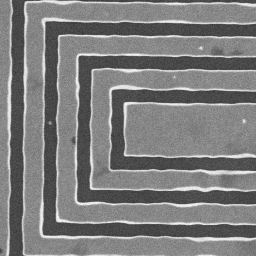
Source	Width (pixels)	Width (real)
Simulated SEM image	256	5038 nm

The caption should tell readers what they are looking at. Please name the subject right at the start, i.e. groups of lines, slits or small figures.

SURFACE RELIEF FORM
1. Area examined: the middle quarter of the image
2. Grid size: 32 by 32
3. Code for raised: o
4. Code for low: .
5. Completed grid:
ooo.............................
ooo....oooooooo....oooooo.....oo
ooo....ooooooooooooooooooooooooo
ooo....ooooooooooooooooooooooooo
ooo....ooooooooooooooooooooooooo
oooo...ooooooooooooooooooooooooo
ooo....ooooo....................
ooo....ooooo....................
oooo...ooooo....................
oooo...ooooo....................
oooo...ooooo...ooooooooooooooooo
ooo....ooooo...ooooooooooooooooo
ooo....ooooo...ooooooooooooooooo
ooo....ooooo...ooooooooooooooooo
ooo....ooooo...ooooooooooooooooo
ooo....ooooo...ooooooooooooooooo
ooo....ooooo...ooooooooooooooooo
ooo....ooooo...ooooooooooooooooo
ooo....ooooo...ooooooooooooooooo
ooo....ooooo...ooooooooooooooooo
ooo....ooooo...ooooooooooooooooo
ooo....ooooo...ooooooooooooooooo
ooo....ooooo...ooooooooooooooooo
ooo....oooo.....................
ooo....oooo.....................
ooo....oooo.....................
ooo....ooooo.........oo...oo....
ooo....ooooooooooooooooooooooooo
ooo....ooooooooooooooooooooooooo
ooo....ooooooooooooooooooooooooo
ooo....ooooooooooooooooooooooooo
ooo....................oooo.....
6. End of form